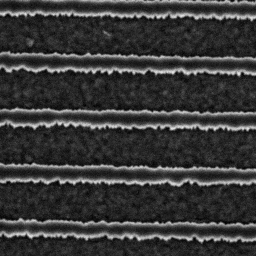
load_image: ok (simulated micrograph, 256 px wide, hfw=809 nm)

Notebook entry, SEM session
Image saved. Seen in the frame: lines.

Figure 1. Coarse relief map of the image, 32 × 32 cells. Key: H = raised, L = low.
HHHHHHHHHHHHHHHHHHHHHHHHHHHHHHHH
HHHHHHHHHHHHHHHHHHHHHHHHHHHHHHHH
LLLLLLLLLLLLLLLLLLLLLLLLLLLLLLLL
LLLLLLLLLLLLLLLLLLLLLLLLLLLLLLLL
LLLLLLLLLLLLLLLLLLLLLLLLLLLLLLLL
LLLLLLLLLLLLLLLLLLLLLLLLLLLLLLLL
LLLLLLLLLLLLLLLLLLLLLLLLLLLLLLLL
HHHHHHHHHHHHHHHHHHHHHHHHHHHHHHHH
HHHHHHHHHHHHHHHHHHHHHHHHHHHHHHHH
LLLLLLLLLLLLLLLLLLLLLLLLLLLLLLLL
LLLLLLLLLLLLLLLLLLLLLLLLLLLLLLLL
LLLLLLLLLLLLLLLLLLLLLLLLLLLLLLLL
LLLLLLLLLLLLLLLLLLLLLLLLLLLLLLLL
LLLLLLLLLLLLLLLLLLLLLLLLLLLLLLLL
HHHHHHHHHHHHHHHHHHHHHHHHHHHHHHHH
HHHHHHHHHHHHHHHHHHHHHHHHHHHHHHHH
LLLLLLLLLLLLLLLLLLLLLLLLLLLLLLLL
LLLLLLLLLLLLLLLLLLLLLLLLLLLLLLLL
LLLLLLLLLLLLLLLLLLLLLLLLLLLLLLLL
LLLLLLLLLLLLLLLLLLLLLLLLLLLLLLLL
LLLLHLLLLLLLLLLLLLLLLLLLLLLLLLLL
HHHHHHHHHHHHHHHHHHHHHHHHHHHHHHHH
HHHHHHHHHHHHHHHHHHHHHHHHHHHHHHHH
LLLLLLLLLLLLLLLLLLLLLLLLLLLLLLLL
LLLLLLLLLLLLLLLLLLLLLLLLLLLLLLLL
LLLLLLLLLLLLLLLLLLLLLLLLLLLLLLLL
LLLLLLLLLLLLLLLLLLLLLLLLLLLLLLLL
HLHHLLHLLLLLLLLLLLLLLLLLLLLLLLLL
HHHHHHHHHHHHHHHHHHHHHHHHHHHHHHHH
LHLHHLHLLHHHHHHHHHHHHHHHHHHHHHHH
LLLLLLLLLLLLLLLLLLLLLLLLLLLLLLLL
LLLLLLLLLLLLLLLLLLLLLLLLLLLLLLLL